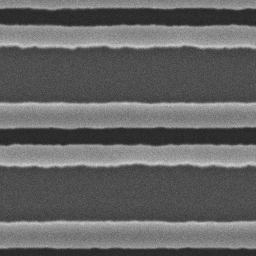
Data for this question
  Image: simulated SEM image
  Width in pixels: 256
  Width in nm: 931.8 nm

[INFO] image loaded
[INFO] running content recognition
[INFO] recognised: lines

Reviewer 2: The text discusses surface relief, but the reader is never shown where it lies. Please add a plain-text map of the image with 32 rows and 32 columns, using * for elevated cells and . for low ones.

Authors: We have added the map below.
********************************
................................
................................
********************************
********************************
********************************
................................
................................
................................
................................
................................
................................
................................
********************************
********************************
********************************
................................
................................
********************************
********************************
***************...**.*..********
................................
................................
................................
................................
................................
................................
................................
********************************
********************************
********************************
................................